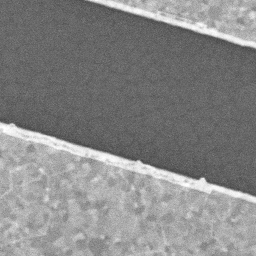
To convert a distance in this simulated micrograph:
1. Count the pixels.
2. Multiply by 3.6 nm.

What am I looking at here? one or a few lines or trenches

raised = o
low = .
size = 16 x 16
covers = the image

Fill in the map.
........oooooooo
...........ooooo
...............o
................
................
................
................
................
ooo.............
oooooo..........
oooooooooo......
ooooooooooooo...
oooooooooooooooo
oooooooooooooooo
oooooooooooooooo
oooooooooooooooo